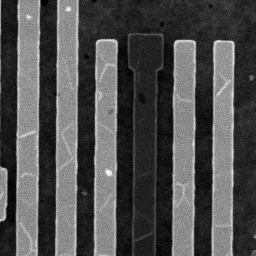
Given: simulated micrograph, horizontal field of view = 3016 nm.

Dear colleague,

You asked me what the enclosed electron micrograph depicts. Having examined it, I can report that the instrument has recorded wiring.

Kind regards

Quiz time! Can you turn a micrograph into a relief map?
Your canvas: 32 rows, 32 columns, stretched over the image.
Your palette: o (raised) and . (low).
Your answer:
..ooo..ooo......................
..ooo..ooo......................
..ooo..ooo......................
..ooo..ooo......................
..ooo..ooo......oooo............
..ooo..ooo..ooo.oooo..oo...oo...
..ooo..ooo..ooo.oooo..oo...oo...
..ooo..ooo..ooo.oooo..oo...oo...
..ooo..ooo..ooo.oooo..oo...oo...
..ooo..ooo..ooo..ooo..oo...oo...
..ooo..ooo..ooo..ooo..oo...oo...
..ooo..ooo..ooo..ooo..oo...oo...
..ooo..ooo..ooo..ooo..oo...oo...
..ooo..ooo..ooo..ooo..oo...oo...
..ooo..ooo..ooo..ooo..oo...oo...
..ooo..ooo..oo...ooo..oo...oo...
..ooo..ooo..oo...oo...oo...oo...
..ooo..ooo..oo...oo...oo...oo...
..ooo..ooo..oo...oo...oo...oo...
..ooo..ooo..oo...oo...oo...oo...
..ooo..ooo..oo...oo...oo...oo...
o.ooo..ooo..oo...oo...oo...oo...
o.ooo..ooo..oo...oo...oo...oo...
o.ooo..ooo..oo...oo...oo...oo...
o.ooo..ooo..oo...oo...oo...oo...
o.ooo..ooo..oo...oo...oo...oo...
o.ooo..ooo..oo...oo...oo...oo...
..ooo..ooo..oo...oo...oo...oo...
..ooo..ooo..oo...oo...oo...oo...
..ooo..ooo..oo...oo...oo...oo...
..ooo..ooo..oo...oo...oo...oo...
..ooo..oo...oo...oo...oo..ooo...